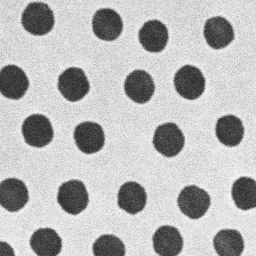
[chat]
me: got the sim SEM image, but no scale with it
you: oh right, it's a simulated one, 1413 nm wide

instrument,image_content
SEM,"a regular array of holes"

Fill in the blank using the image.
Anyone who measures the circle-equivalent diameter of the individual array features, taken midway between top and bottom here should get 183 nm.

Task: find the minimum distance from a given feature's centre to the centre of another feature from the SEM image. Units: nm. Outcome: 311